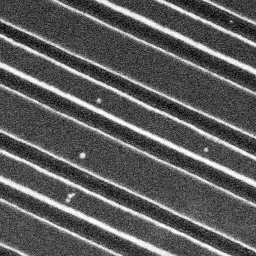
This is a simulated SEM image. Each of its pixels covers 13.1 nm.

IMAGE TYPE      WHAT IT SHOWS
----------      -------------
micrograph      lines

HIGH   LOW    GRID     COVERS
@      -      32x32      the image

@@@@@@@@-----@@@@@@@@-----@@@@@@
@@@@@@@@@@-----@@@@@@@@------@@@
@@@@@@@@@@@@------@@@@@@@------@
--@@@@@@@@@@@@------@@@@@@@@----
----@@@@@@@@@@@@------@@@@@@@@--
@@----@@@@@@@@@@@@@-----@@@@@@@@
@@@@----@@@@@@@@@@@@@-----@@@@@@
@@@@@@-----@@@@@@@@@@@@-----@@@@
-@@@@@@@@----@@@@@@@@@@@@------@
---@@@@@@@@----@@@@@@@@@@@@-----
-----@@@@@@@@----@@@@@@@@@@@@---
@@-----@@@@@@@@----@@@@@@@@@@@@-
@@@@-----@@@@@@@@-----@@@@@@@@@@
@@@@@@-----@@@@@@@@-----@@@@@@@@
@@@@@@@@-----@@@@@@@@-----@@@@@@
@@@@@@@@@@-----@@@@@@@@-----@@@@
@@@@@@@@@@@@@----@@@@@@@@-----@@
--@@@@@@@@@@@@@-----@@@@@@@-----
-----@@@@@@@@@@@@-----@@@@@@@---
@@-----@@@@@@@@@@@@-----@@@@@@@-
@@@@-----@@@@@@@@@@@@-----@@@@@@
@@@@@@-----@@@@@@@@@@@@-----@@@@
@@@@@@@@-----@@@@@@@@@@@@------@
--@@@@@@@@-----@@@@@@@@@@@@-----
----@@@@@@@@-----@@@@@@@@@@@@---
@------@@@@@@@-----@@@@@@@@@@@@@
@@@------@@@@@@@@----@@@@@@@@@@@
@@@@@------@@@@@@@@-----@@@@@@@@
@@@@@@@@-----@@@@@@@@-----@@@@@@
@@@@@@@@@@-----@@@@@@@@-----@@@@
@@@@@@@@@@@@------@@@@@@@-----@@
--@@@@@@@@@@@@------@@@@@@@-----